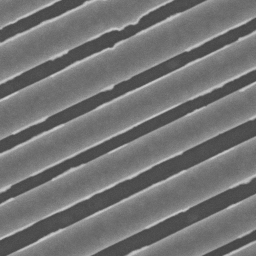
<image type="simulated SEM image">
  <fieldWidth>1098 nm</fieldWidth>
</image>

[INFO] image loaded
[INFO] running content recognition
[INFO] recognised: parallel lines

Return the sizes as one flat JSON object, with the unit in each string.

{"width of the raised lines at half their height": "150 nm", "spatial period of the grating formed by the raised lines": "205 nm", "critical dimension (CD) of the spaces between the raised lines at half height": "53.7 nm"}